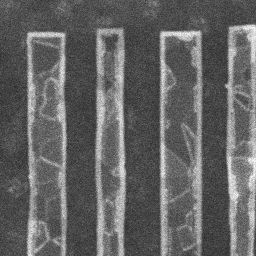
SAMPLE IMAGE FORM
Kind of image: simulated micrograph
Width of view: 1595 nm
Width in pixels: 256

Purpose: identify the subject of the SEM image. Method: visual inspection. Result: one or a few lines or trenches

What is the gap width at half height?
224 nanometers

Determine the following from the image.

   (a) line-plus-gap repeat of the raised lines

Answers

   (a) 407 nm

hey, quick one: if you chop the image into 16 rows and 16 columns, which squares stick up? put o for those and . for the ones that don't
................
................
..oo..oo..oo..oo
..oo..oo..oo..oo
..oo..oo..oo..oo
..oo..oo..oo..oo
..oo..oo..oo..oo
..oo..oo..oo..oo
..oo..oo..oo..oo
..oo..oo..oo..oo
..oo..oo..oo..oo
..oo..oo..oo..oo
..oo..oo..oo..oo
..oo..oo..oo..oo
..oo..oo..oo...o
..oo..oo..oo...o